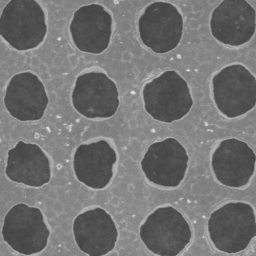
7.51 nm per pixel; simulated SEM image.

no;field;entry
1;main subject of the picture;a regular array of holes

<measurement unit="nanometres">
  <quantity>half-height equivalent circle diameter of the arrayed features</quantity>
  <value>359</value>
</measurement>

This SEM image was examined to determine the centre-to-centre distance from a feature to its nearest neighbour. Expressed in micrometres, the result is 0.5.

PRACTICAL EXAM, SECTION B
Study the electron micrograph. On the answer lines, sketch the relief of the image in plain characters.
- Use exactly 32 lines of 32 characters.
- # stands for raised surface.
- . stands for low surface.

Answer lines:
#....##############..#######...#
......###.....####....#####.....
......###.....###......###......
......###.....###......###......
......###.....####.....####.....
#....####.....####....######..##
###########..######..###########
################################
############################...#
##...#####...#######...####.....
#....####.....####.....###......
#.....###......###......##......
#.....###......###......###.....
#.....###......###......###.....
##...#####....#####....#####..##
################################
################################
############.#######..######..##
##...#####....#####....####....#
#.....###......###.....###......
#.....###.....####.....###......
#.....###.....####.....####.....
#.....####....#####....####....#
############.#######.###########
################################
##.#########################...#
#....#####...######...#####.....
#.....###.....####.....###......
......###......###......##......
......###......###......##......
#.....####....####.....####....#
##...######...#####....#####..##